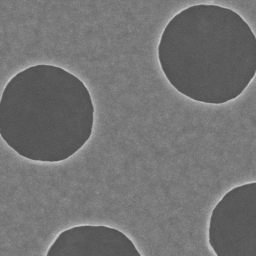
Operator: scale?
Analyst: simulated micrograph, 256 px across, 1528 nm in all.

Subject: holes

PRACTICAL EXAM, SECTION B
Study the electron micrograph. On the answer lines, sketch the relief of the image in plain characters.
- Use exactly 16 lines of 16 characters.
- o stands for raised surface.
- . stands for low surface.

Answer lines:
oooooooooooo..oo
ooooooooooo....o
oooooooooo......
oooooooooo......
o...oooooo......
.....oooooo....o
......oooooooooo
......oooooooooo
......oooooooooo
o....ooooooooooo
oooooooooooooooo
ooooooooooooooo.
oooooooooooooo..
ooooooooooooo...
oooo....ooooo...
ooo.....ooooo...